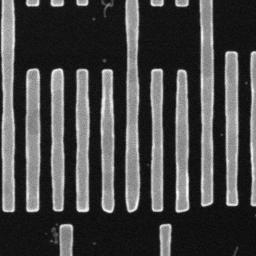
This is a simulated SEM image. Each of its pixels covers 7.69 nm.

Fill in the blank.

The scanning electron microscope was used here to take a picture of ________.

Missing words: wiring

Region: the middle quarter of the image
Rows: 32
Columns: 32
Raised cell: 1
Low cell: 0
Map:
00000000000000001100000000000000
00000000000000001100000100000000
00011100001100001100001100001100
00011100001100001100001100001110
00011100001100001110001100001110
00011100001100001110001100001110
00011100001100001110001100001110
00011100001100001110001100001110
00011100001100001110001100001110
00011100001100001110001100001110
00011100011100001110001100001110
00011100011100001100001100001110
00011100011100001100001100001110
00011100011100001100001100001110
00011100011100001100001100001110
00011100011100001100001100001110
00011100011100001100001100001110
00011100011100001100001100001110
00011100011100001100001100001110
00011100011100001100001100001110
00011100011100001110001100001110
00011100011100001110001100001110
00011100011100001110001100001110
00011100001100001110001110001110
00011100001100001110001110001110
00011100001100001110001110001110
00011100001100001110001110001110
00011100001100011110001110001010
00011100001100011110001110001100
00011100001100011110001110001100
00011100001100011110001110001000
00011100001100011110001110001000